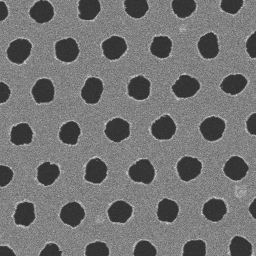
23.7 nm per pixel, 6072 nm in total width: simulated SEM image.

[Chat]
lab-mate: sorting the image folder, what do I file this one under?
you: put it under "a regular array of holes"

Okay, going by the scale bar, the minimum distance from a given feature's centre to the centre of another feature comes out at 1100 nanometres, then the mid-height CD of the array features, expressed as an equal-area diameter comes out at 23.7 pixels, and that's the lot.